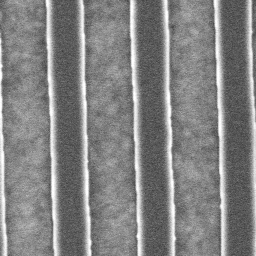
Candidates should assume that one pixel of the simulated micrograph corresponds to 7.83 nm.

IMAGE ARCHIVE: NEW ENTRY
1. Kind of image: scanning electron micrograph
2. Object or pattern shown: lines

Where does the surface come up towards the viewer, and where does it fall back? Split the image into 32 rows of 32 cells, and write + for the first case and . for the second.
......++++......+++++......++++.
......++++......+++++......++++.
......++++......+++++......++++.
......++++......+++++......++++.
......++++......+++++......++++.
......++++.......++++......++++.
......++++.......++++......++++.
......++++.......++++......++++.
......++++.......++++......++++.
......++++.......++++......+++++
......+++++......++++......+++++
......+++++......++++......+++++
......+++++......++++......+++++
......+++++......++++......+++++
......+++++......++++......+++++
......+++++......++++......+++++
......+++++......++++......+++++
......+++++......++++.......++++
......+++++......++++.......++++
......+++++......++++.......++++
.......++++......++++.......++++
.......++++......++++.......++++
.......++++......+++++......++++
.......++++......+++++......++++
.......++++......+++++......++++
.......++++......+++++......++++
.......++++......+++++......++++
.......++++......+++++......++++
+......++++......+++++......++++
+......++++......+++++......++++
+......++++......+++++......++++
+......++++......+++++......++++